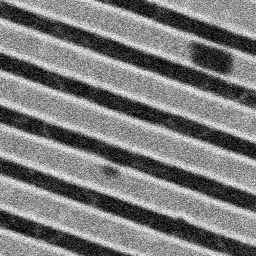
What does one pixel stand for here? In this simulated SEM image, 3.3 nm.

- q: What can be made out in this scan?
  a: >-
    parallel lines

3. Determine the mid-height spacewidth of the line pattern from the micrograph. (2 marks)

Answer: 21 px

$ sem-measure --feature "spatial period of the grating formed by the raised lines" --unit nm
162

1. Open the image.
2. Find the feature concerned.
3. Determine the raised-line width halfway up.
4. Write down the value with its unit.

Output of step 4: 91.4 nm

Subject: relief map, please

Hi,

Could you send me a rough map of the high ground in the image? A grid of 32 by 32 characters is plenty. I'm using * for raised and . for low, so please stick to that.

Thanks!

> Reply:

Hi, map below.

..***********.......************
.....***********.......*********
........**********........******
***........**********........***
******........**********.......*
*********.......***********.....
.**********........***********..
....**********........**********
......***********.......********
*........***********.......*****
****........**********........**
*******.......***********.......
**********.......***********....
..***********.......***********.
.....**********........*********
.......***********........******
***.......***********........***
*****........***********.......*
********........***********.....
***********........***********..
...***********........**********
......***********........*******
*........**********........*****
****........**********........**
*******.......***********.......
**********.......***********....
..***********.......***********.
....***********........*********
.......***********........******
***.......***********........***
*****........***********........
********........**********......